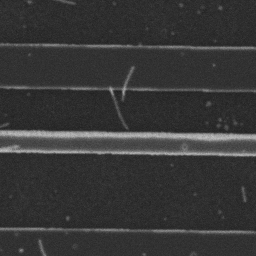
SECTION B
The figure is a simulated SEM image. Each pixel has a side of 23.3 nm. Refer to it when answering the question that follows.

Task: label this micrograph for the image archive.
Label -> lines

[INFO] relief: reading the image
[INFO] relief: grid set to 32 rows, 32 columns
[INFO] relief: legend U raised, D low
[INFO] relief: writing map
DDDDDDDDDDDDDDDDDDDDDDDDDDDDDDDD
DDDDDDDDDDDDDDDDDDDDDDDDDDDDDDDD
DDDDDDDDDDDDDDDDDDDDDDDDDDDDDDDD
DDDDDDDDDDDDDDDDDDDDDDDDDDDDDDDD
DDDDDDDDDDDDDDDDDDDDDDDDDDDDDDDD
DDDDDDDDDDDDDDDDDDDDDDDDDDDDDDDD
UUUUUUUUUUUUUUUUUUUUUUUUUUUUUUUU
UUUUUUUUUUUUUUUUUUUUUUUUUUUUUUUU
UUUUUUUUUUUUUUUUUUUUUUUUUUUUUUUU
UUUUUUUUUUUUUUUUUUUUUUUUUUUUUUUU
UUUUUUUUUUUUUUUUUUUUUUUUUUUUUUUU
DDDDDDDDDDDDDDDDDDDDDDDDDDDDDDDD
DDDDDDDDDDDDDDDDDDDDDDDDDDDDDDDD
DDDDDDDDDDDDDDDDDDDDDDDDDDDDDDDD
DDDDDDDDDDDDDDDDDDDDDDDDDDDDDDDD
DDDDDDDDDDDDDDDDDDDDDDDDDDDDDDDD
UUDDDDDDDDDDDDDDDDDDDDDDDDDDDDDD
UUUUUUUUUUUUUUUUUUUUUUUUUUUUUUUU
UUUUUUUUUUUUUUUUUUUUUUUUUUUUUUUU
DDDDDDDDDDDDDDDDDDDDDDDDDDDDDDDD
DDDDDDDDDDDDDDDDDDDDDDDDDDDDDDDD
DDDDDDDDDDDDDDDDDDDDDDDDDDDDDDDD
DDDDDDDDDDDDDDDDDDDDDDDDDDDDDDDD
DDDDDDDDDDDDDDDDDDDDDDDDDDDDDDDD
DDDDDDDDDDDDDDDDDDDDDDDDDDDDDDDD
DDDDDDDDDDDDDDDDDDDDDDDDDDDDDDDD
DDDDDDDDDDDDDDDDDDDDDDDDDDDDDDDD
DDDDDDDDDDDDDDDDDDDDDDDDDDDDDDDD
DDDDDDDDDDDDDDDDDDDDDDDDDDDDDDDD
UUUUUUUUUUUUUUUUUUUUUUUUUUUUUUUU
UUUUUUUUUUUUUUUUUUUUUUUUUUUUUUUU
UUUUUUUUUUUUUUUUUUUUUUUUUUUUUUUU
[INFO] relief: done